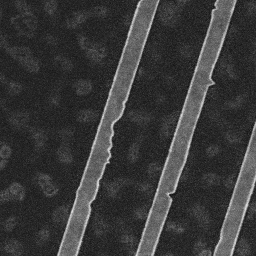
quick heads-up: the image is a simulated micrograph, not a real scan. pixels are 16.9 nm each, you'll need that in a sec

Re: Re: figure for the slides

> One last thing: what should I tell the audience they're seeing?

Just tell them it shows one or a few lines or trenches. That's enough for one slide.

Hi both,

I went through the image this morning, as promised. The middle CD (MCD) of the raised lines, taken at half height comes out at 291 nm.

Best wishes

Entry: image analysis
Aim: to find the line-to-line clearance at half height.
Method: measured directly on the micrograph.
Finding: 57.3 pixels